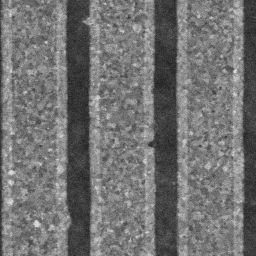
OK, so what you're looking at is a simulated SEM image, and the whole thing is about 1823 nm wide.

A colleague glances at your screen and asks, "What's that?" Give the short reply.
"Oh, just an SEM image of one or a few lines or trenches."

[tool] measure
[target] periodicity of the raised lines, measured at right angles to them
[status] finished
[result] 626 nm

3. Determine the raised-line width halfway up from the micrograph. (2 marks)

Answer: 381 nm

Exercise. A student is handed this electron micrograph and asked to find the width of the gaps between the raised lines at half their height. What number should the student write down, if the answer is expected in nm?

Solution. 241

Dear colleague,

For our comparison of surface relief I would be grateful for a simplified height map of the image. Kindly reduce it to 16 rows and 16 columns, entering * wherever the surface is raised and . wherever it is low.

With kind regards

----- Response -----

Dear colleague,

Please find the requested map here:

****..***..****.
****..***..****.
****..***..****.
****..***..****.
.***..***..****.
.***..***..****.
.***..***..****.
.***..***..****.
.***..***..****.
.***..***..****.
.***..***..****.
.***..***...***.
.***..***..****.
****..***..****.
****..***..****.
.***..***..****.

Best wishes